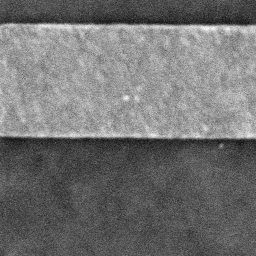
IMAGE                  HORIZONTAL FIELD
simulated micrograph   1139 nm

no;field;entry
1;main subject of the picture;wiring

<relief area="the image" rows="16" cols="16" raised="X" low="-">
----------------
----------------
XXXXXXXXXXXXXXXX
XXXXXXXXXXXXXXXX
XXXXXXXXXXXXXXXX
XXXXXXXXXXXXXXXX
XXXXXXXXXXXXXXXX
XXXXXXXXXXXXXXXX
-XXXXXXXXXXXXXXX
----------------
----------------
----------------
----------------
----------------
----------------
----------------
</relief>